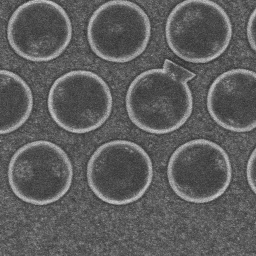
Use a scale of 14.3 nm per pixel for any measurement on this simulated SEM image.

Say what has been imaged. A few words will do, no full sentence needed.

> raised bodies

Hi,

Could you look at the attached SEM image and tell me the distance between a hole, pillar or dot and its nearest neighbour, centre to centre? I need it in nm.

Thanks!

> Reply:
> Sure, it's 1140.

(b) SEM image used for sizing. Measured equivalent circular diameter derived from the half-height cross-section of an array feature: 59.2 px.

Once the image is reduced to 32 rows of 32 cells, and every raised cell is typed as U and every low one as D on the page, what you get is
DDDUUUUDDDDDDDUUDDDDDDDUUUUDDDDD
DDUUUUUUDDDDUUUUUUDDDDUUUUUUDDDD
DDUUUUUUDDDDUUUUUUDDDUUUUUUUDDDU
DUUUUUUUUDDUUUUUUUDDDUUUUUUUUDDU
DUUUUUUUUDDUUUUUUUDDDUUUUUUUUDDU
DDUUUUUUDDDDUUUUUUDDDUUUUUUUDDDD
DDUUUUUDDDDDUUUUUDDDDDUUUUUDDDDD
DDDDDDDDDDDDDDDDDDDDDDDDDDDDDDDD
DDDDDDDDDDDDDDDDDDDDDUUDDDDDDDDD
UUDDDDDDUUUUDDDDDDUUUUUUDDDDUUUU
UUUDDDDUUUUUUDDDDUUUUUUDDDDUUUUU
UUUUDDUUUUUUUDDDUUUUUUUDDDUUUUUU
UUUUDDUUUUUUUUDDUUUUUUUUDDUUUUUU
UUUUDDUUUUUUUUDDUUUUUUUUDDUUUUUU
UUUDDDDUUUUUUDDDUUUUUUUDDDDUUUUU
UUDDDDDDUUUUDDDDDUUUUUDDDDDDUUUU
DDDDDDDDDDDDDDDDDDDDDDDDDDDDDDDD
DDDDDDDDDDDDDDDDDDDDDDDDDDDDDDDD
DDDUUUUDDDDDDUUUUDDDDDDUUUUDDDDD
DDUUUUUUDDDDUUUUUUDDDDUUUUUUDDDD
DUUUUUUUUDDUUUUUUUUDDUUUUUUUDDDU
DUUUUUUUUDDUUUUUUUUDDUUUUUUUUDDU
DUUUUUUUUDDUUUUUUUUDDUUUUUUUUDDU
DDUUUUUUDDDDUUUUUUDDDDUUUUUUDDDD
DDDUUUUDDDDDDUUUUDDDDDDUUUUDDDDD
DDDDDDDDDDDDDDDDDDDDDDDDDDDDDDDD
DDDDDDDDDDDDDDDDDDDDDDDDDDDDDDDD
DDDDDDDDDDDDDDDDDDDDDDDDDDDDDDDD
DDDDDDDDDDDDDDDDDDDDDDDDDDDDDDDD
DDDDDDDDDDDDDDDDDDDDDDDDDDDDDDDD
DDDDDDDDDDDDDDDDDDDDDDDDDDDDDDDD
DDDDDDDDDDDDDDDDDDDDDDDDDDDDDDDD